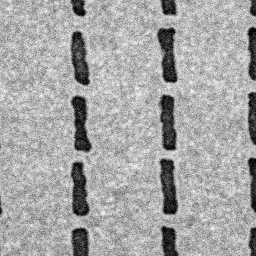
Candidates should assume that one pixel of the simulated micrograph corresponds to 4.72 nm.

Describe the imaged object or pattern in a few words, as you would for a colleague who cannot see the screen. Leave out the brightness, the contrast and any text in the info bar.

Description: holes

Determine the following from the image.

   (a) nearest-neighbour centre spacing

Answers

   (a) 310 nanometres